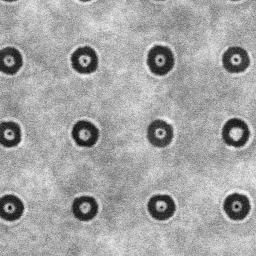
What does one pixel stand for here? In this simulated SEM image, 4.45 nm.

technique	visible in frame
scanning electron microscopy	a regular array of ring-shaped grooves with a dot in the middle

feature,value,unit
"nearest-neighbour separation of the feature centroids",73.3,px